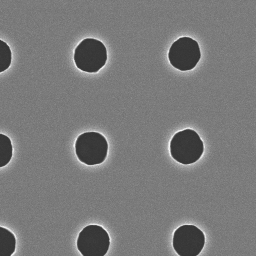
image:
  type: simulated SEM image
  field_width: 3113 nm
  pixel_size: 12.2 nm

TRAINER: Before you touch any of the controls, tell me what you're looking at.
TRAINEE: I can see holes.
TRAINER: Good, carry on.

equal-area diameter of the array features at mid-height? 408 nm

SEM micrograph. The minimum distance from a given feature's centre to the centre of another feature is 92.8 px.